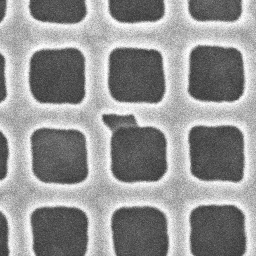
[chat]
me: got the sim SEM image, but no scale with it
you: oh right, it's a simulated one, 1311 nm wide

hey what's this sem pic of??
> holes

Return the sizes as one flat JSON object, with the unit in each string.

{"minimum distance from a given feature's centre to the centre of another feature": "398 nanometers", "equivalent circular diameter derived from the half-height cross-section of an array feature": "316 nm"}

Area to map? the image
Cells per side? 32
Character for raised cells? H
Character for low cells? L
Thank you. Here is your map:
LHHHLLLLLLLHHHLLLLLLLHHLLLLLLLHH
LHHHLLLLLLLHHHLLLLLLLHHHLLLLLLHH
HHHHHLLLLLHHHHLLLLLLHHHHLLLLLLHH
HHHHHHHHHHHHHHHHHHHHHHHHHHHHHHHH
HHHHHHHHHHHHHHHHHHHHHHHHHHHHHHHH
HHHHHHHHHHHHHHHHHHHHHHHHHHHHHHHH
HHHHLLLLLLHHHHLLLLLLHHHHLLLLLLHH
LHHHLLLLLLLHHHLLLLLLHHHHLLLLLLHH
LHHHLLLLLLLHHLLLLLLLHHHHLLLLLLLH
LHHHLLLLLLLHHLLLLLLLLHHHLLLLLLLH
LHHHLLLLLLLHHLLLLLLLLHHLLLLLLLLH
LHHHLLLLLLLHHHLLLLLLLHHHLLLLLLLH
LHHHLLLLLLHHHHLLLLLLHHHHHLLLLLHH
HHHHHHHHHHHHHHHHHHHHHHHHHHHHHHHH
HHHHHHHHHHHHHLLLLHHHHHHHHHHHHHHH
HHHHHHHHHHHHHLLLLHHHHHHHHHHHHHHH
HHHHLLLLLLHHHHLLLLLLHHHHLLLLLLHH
LHHHLLLLLLLHHHLLLLLLLHHLLLLLLLLH
LHHHLLLLLLLHHHLLLLLLLHHHLLLLLLLH
LHHHLLLLLLLHHHLLLLLLLHHHLLLLLLLH
LHHHLLLLLLLHHHLLLLLLLHHHLLLLLLLH
LHHHLLLLLLLHHHLLLLLLLHHHLLLLLLLH
HHHHHLLLLLLHHHHLLLLLHHHHHLLLLLHH
HHHHHHHHHHHHHHHHHHHHHHHHHHHHHHHH
HHHHHHHHHHHHHHHHHHHHHHHHHHHHHHHH
HHHHHHHHHHHHHHHHHHHHHHHHHHHHLHHH
HHHHLLLLLLLHHHLLLLLLHHHHLLLLLLHH
LHHHLLLLLLLHHHLLLLLLLHHHLLLLLLLH
LHHHLLLLLLLHHHLLLLLLLHHHLLLLLLLH
LHHHLLLLLLLHHHLLLLLLLHHHLLLLLLLH
LHHHLLLLLLLHHHLLLLLLLHHHLLLLLLLH
LHHHLLLLLLLHHHLLLLLLLHHHLLLLLLLH